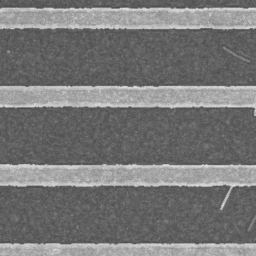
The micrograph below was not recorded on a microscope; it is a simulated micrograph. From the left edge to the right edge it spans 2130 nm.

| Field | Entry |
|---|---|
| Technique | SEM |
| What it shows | lines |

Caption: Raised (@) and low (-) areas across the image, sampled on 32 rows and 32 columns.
--------------------------------
@@@@@@@@@@@@@@@@@@@@@@@@@@@@@@@@
@@@@@@@@@@@@@@@@@@@@@@@@@@@@@@@@
------------------------@--@@-@-
--------------------------------
--------------------------------
--------------------------------
--------------------------------
--------------------------------
--------------------------------
--------------------------------
@@@@@@@@@@@@@@@@@@@@@@@@@@@@@@@@
@@@@@@@@@@@@@@@@@@@@@@@@@@@@@@@@
--------------------------------
--------------------------------
--------------------------------
--------------------------------
--------------------------------
--------------------------------
--------------------------------
--------------------------------
@@@@@@@@@@@@@@@@@@@@@@@@@@@@@@@@
@@@@@@@@@@@@@@@@@@@@@@@@@@@@@@@@
--------------------------------
--------------------------------
--------------------------------
--------------------------------
--------------------------------
--------------------------------
--------------------------------
--------------------------------
@@@@@@@@@@@@@@@@@@@@@@@@@@@@@@@@